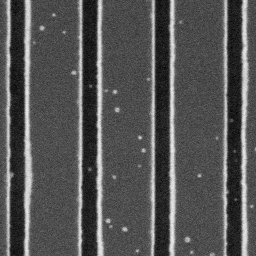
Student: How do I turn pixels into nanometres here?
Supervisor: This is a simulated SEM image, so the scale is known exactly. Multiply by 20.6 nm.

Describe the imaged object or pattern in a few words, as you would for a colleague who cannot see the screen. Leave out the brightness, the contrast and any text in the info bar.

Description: lines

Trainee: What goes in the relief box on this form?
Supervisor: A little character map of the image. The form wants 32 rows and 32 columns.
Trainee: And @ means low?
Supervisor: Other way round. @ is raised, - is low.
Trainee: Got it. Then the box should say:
@--@@@@@@@--@@@@@@@---@@@@@@---@
@--@@@@@@@--@@@@@@@--@@@@@@@---@
@--@@@@@@@--@@@@@@@--@@@@@@@---@
@--@@@@@@@--@@@@@@@--@@@@@@@---@
@--@@@@@@@--@@@@@@@--@@@@@@@---@
@--@@@@@@@--@@@@@@@--@@@@@@@---@
@--@@@@@@@--@@@@@@@---@@@@@@---@
@--@@@@@@@--@@@@@@@--@@@@@@@---@
@--@@@@@@@--@@@@@@@--@@@@@@@---@
@--@@@@@@@--@@@@@@@--@@@@@@@---@
@--@@@@@@@--@@@@@@@--@@@@@@@---@
@--@@@@@@@--@@@@@@@--@@@@@@@---@
@--@@@@@@@--@@@@@@@--@@@@@@@---@
@--@@@@@@@--@@@@@@@--@@@@@@@---@
@--@@@@@@@--@@@@@@@--@@@@@@@--@@
@--@@@@@@@--@@@@@@@--@@@@@@@--@@
@--@@@@@@@--@@@@@@@--@@@@@@@--@@
@--@@@@@@@--@@@@@@@--@@@@@@@--@@
@--@@@@@@@--@@@@@@@--@@@@@@@--@@
@--@@@@@@@--@@@@@@@---@@@@@@---@
@--@@@@@@@--@@@@@@@--@@@@@@@--@@
@--@@@@@@@--@@@@@@@--@@@@@@@--@@
@---@@@@@@--@@@@@@@---@@@@@@--@@
@--@@@@@@@--@@@@@@@---@@@@@@--@@
@--@@@@@@@--@@@@@@@---@@@@@@--@@
@--@@@@@@@--@@@@@@@---@@@@@@---@
@--@@@@@@@--@@@@@@@--@@@@@@@---@
@--@@@@@@@--@@@@@@@--@@@@@@@---@
@--@@@@@@@--@@@@@@@--@@@@@@@---@
@--@@@@@@@--@@@@@@@--@@@@@@@---@
@--@@@@@@@--@@@@@@@--@@@@@@@---@
@--@@@@@@@--@@@@@@@--@@@@@@@---@